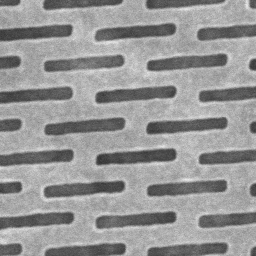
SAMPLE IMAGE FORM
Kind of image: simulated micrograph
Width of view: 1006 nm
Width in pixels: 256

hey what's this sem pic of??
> a regular array of holes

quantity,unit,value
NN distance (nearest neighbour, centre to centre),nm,233